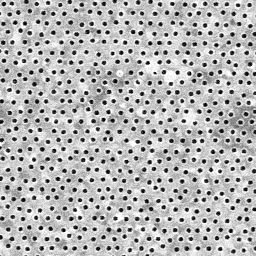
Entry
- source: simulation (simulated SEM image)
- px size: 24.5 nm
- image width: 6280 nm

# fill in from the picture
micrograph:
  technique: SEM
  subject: a regular array of holes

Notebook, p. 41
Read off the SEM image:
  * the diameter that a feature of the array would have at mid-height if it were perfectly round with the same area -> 127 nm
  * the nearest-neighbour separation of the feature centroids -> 0.227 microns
